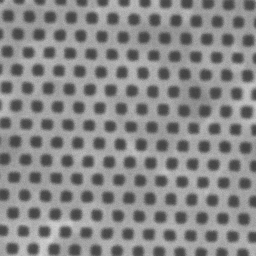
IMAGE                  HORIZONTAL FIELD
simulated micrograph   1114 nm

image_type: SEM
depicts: a regular array of holes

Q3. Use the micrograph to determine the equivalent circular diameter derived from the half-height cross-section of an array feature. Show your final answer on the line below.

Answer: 61.1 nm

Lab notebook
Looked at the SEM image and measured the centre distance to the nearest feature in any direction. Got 88.8 nanometers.